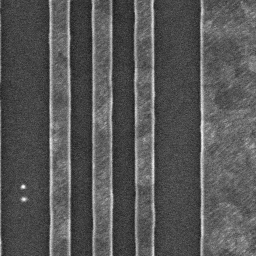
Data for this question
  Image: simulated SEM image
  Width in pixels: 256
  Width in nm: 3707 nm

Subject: wiring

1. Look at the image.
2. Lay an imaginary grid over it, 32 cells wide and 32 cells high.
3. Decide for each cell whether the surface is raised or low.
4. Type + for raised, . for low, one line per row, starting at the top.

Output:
......+++...++...++......+++++++
......+++...++...++......+++++++
......+++...++...++......+++++++
......+++...++...++......+++++++
......+++...++...++......+++++++
......+++...++...++......+++++++
......+++...++...++......+++++++
......+++...++...++......+++++++
......+++...++...++......+++++++
......+++...++...++......+++++++
......+++...++...++......+++++++
......+++...++...++......+++++++
......+++...++...++......+++++++
......+++...++...++......+++++++
......+++...++...++......+++++++
......+++...++...++......+++++++
......+++...++...++......+++++++
......+++...++...++......+++++++
......+++...++...++......+++++++
......+++...++...++......+++++++
......+++...++...++......+++++++
......+++...++...++......+++++++
......+++...++...++......+++++++
......+++...++...++......+++++++
......+++...++...++......+++++++
......+++...++...++......+++++++
......+++...++...++......+++++++
......+++...++...++......+++++++
......+++...++...++......+++++++
......+++...++...++......+++++++
......+++...++...++......+++++++
......+++...++...++......+++++++